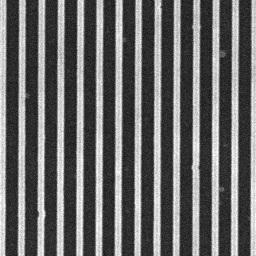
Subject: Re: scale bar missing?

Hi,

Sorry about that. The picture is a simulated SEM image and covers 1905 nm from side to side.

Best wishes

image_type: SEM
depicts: parallel lines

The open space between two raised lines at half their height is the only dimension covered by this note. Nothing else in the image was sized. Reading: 99.5 nm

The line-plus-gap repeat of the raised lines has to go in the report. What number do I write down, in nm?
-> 144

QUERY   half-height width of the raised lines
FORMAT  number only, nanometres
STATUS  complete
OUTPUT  40